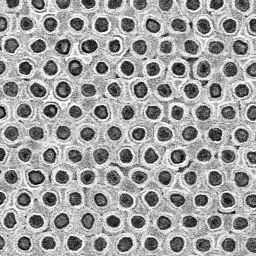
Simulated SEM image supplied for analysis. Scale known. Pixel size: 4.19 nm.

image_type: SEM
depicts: a regular array of holes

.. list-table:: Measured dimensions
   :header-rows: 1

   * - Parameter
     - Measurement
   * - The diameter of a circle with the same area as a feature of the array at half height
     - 61.5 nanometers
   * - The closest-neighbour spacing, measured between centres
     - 103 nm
